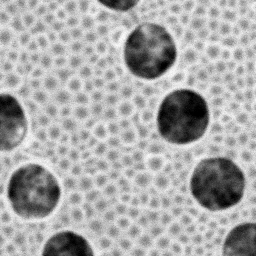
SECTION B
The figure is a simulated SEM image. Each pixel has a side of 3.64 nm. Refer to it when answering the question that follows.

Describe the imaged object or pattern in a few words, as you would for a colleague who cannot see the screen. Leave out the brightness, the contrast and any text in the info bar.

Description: holes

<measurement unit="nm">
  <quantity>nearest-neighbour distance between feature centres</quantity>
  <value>271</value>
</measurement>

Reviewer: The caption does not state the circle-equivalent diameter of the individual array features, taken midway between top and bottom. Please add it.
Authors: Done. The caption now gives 210 nm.